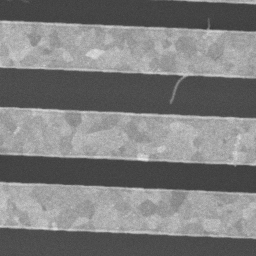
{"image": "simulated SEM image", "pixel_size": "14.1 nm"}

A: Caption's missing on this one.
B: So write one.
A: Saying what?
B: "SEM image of lines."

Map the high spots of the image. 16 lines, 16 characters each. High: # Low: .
................
####............
################
################
.......#########
................
................
################
################
################
................
###.............
################
################
.......#########
................